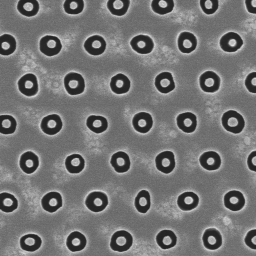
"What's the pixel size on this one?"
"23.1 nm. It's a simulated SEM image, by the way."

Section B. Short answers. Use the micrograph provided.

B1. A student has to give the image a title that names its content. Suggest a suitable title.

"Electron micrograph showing a regular array of ring-shaped grooves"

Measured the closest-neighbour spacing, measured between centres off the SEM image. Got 1020 nanometers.